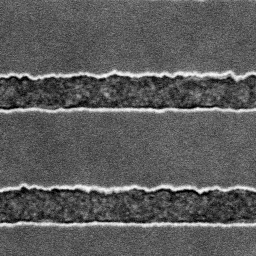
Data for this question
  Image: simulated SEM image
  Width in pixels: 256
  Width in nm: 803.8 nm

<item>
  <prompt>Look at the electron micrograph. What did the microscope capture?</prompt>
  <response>lines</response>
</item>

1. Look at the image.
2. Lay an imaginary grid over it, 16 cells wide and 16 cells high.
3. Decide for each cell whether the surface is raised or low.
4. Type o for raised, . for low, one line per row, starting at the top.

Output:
oooooooooooooooo
oooooooooooooooo
oooooooooooooooo
oooooooooooooooo
oooooooooooooooo
................
................
oooooooooooooooo
oooooooooooooooo
oooooooooooooooo
oooooooooooooooo
oooooooooooooooo
................
................
oooooooooooooooo
oooooooooooooooo